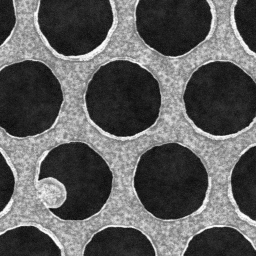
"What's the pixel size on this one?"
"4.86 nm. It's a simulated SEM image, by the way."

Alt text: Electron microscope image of holes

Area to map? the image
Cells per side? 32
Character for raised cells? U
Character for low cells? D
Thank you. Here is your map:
DDUUUDDDDDDDDDUUUDDDDDDDDDUUUDDD
DDUUUDDDDDDDDDUUUDDDDDDDDDUUUDDD
DDUUUDDDDDDDDDUUUDDDDDDDDDDUUDDD
DDUUUDDDDDDDDDUUUDDDDDDDDDUUUUDD
DUUUUDDDDDDDDUUUUDDDDDDDDDUUUUDD
UUUUUUDDDDDDDUUUUUDDDDDDDUUUUUUD
UUUUUUUDDDDUUUUUUUUUDDDDUUUUUUUU
UUUDUUUUUUUUUUUDUUUUUUUUUUUUUUUU
DDDDDDUUUUUUDDDDDDUUUUUUUDDDDDUU
DDDDDDDUUUUUDDDDDDDUUUUUDDDDDDDU
DDDDDDDDUUUDDDDDDDDDUUUDDDDDDDDD
DDDDDDDDUUUDDDDDDDDDUUUDDDDDDDDD
DDDDDDDDUUUDDDDDDDDDUUUDDDDDDDDD
DDDDDDDDUUUDDDDDDDDDUUUDDDDDDDDD
DDDDDDDUUUUDDDDDDDDDUUUDDDDDDDDD
DDDDDDDUUUUUDDDDDDDUUUUUDDDDDDDU
UDDDDDUUUUUUUDDDDDUUUUUUUDDDDDUU
UUUUUUUUUUUUUUUUUUUUUUUUUUUUUUUU
UUUUUUUDDDDUUUUUUUUDDDDUUUUUUUUD
DUUUUUDDDDDDDUUUUUDDDDDDDUUUUUDD
DUUUUDDDDDDDDUUUUDDDDDDDDUUUUDDD
DDUUUDDDDDDDDDUUUDDDDDDDDDUUUDDD
DDUUUDUDDDDDDDUUUDDDDDDDDDUUUDDD
DDUUUUUUDDDDDDUUUDDDDDDDDDUUUDDD
DDUUUUUUDDDDDDUUUDDDDDDDDDUUUDDD
DUUUUUUDDDDDDUUUUUDDDDDDDUUUUUDD
UUUUUUDDDDDDUUUUUUUDDDDDUUUUUUDD
UUUUUUUUDDDUUUUUUUUUUUUUUUUUUUUU
UUDDDUUUUUUUUDDDDUUUUUUUUUDDDUUU
DDDDDDUUUUUUDDDDDDUUUUUUDDDDDDDU
DDDDDDDUUUUDDDDDDDDUUUUDDDDDDDDD
DDDDDDDDUUDDDDDDDDDUUUUDDDDDDDDD